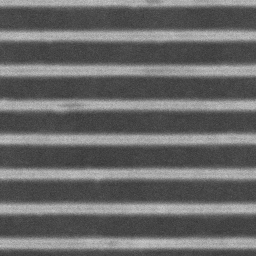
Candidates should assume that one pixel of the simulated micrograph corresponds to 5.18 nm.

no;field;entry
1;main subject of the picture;parallel lines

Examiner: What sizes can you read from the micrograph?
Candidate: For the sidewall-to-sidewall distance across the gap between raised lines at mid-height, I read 118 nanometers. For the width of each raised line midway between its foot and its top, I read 61.5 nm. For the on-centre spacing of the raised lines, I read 0.179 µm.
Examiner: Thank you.